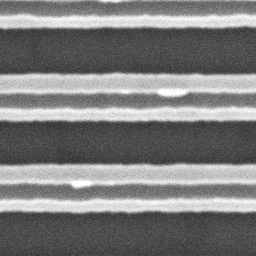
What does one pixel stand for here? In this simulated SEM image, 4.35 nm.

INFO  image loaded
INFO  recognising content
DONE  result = lines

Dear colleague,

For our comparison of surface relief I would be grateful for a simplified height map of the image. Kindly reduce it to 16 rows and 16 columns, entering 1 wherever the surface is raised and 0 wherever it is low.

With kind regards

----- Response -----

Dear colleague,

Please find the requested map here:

1111111111111111
1111111111111111
0000000000000000
0000000000000000
0000000000000000
1111111111111111
1111111111111111
1100000110110100
0000000000000000
0000000000000000
1111111111111111
1111111111111111
1111111111111111
0000000000000000
0000000000000000
0000000000000000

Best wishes